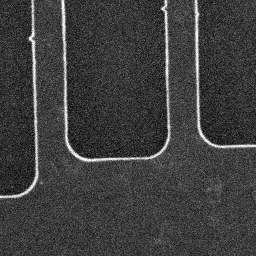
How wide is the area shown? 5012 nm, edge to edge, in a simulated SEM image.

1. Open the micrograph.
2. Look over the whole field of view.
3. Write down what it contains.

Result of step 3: one or a few lines or trenches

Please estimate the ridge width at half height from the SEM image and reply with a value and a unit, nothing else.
607 nm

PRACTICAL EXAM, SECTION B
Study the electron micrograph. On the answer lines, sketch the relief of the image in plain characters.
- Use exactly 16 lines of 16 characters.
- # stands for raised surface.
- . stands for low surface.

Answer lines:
..##......##....
..##......##....
..##......##....
..##......##....
..##......##....
..##......##....
..##.......#....
..##.......#....
..##.......##...
..###.....######
..##############
..##############
################
################
################
################